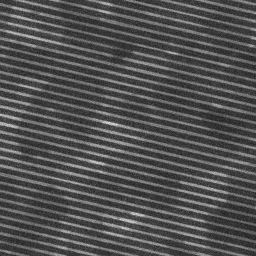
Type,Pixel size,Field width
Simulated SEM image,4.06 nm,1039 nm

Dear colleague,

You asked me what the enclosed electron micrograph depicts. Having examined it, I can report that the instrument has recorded parallel lines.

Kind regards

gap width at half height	0.0247	microns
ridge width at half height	1.7	px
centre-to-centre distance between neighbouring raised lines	33.5	nanometres